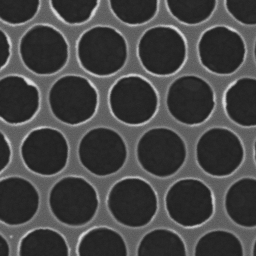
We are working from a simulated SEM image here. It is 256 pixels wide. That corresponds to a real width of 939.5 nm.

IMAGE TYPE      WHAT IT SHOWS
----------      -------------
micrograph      a regular array of holes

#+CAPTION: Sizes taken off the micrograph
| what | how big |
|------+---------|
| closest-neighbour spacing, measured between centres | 210 nanometers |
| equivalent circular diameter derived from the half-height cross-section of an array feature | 174 nm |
